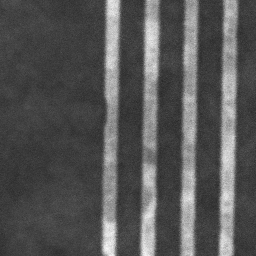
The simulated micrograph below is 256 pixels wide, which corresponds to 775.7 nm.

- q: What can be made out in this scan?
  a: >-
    parallel lines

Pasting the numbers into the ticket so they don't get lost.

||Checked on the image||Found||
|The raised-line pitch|118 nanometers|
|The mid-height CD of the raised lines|0.0344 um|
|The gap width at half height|83.6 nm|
